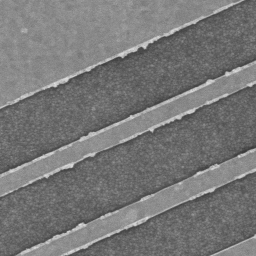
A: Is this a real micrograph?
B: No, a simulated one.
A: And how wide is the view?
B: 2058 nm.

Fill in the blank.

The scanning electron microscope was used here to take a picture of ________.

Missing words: one or a few lines or trenches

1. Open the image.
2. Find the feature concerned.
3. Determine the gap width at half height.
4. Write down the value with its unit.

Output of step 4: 476 nm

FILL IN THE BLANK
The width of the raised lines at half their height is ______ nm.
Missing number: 162